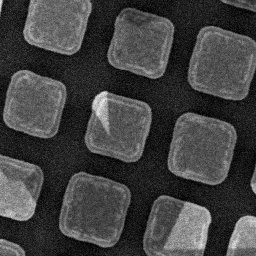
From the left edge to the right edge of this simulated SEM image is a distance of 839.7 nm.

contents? raised bodies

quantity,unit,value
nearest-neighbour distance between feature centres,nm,283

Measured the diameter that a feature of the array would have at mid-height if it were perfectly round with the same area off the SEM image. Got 66.5 px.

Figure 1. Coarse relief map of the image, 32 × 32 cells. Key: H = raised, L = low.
LLLLHHHHHHHLLLLLLLLLLLLLLLLLLHHH
LLLLHHHHHHHLLLLHHHLLLLLLLLLLLLLL
LLLHHHHHHHHLLLLHHHHHHLLLLLLLLLLL
LLLHHHHHHHHLLLHHHHHHHHLLLHHLLLLL
LLLHHHHHHHLLLLHHHHHHHHLLLHHHHHHL
LLLLHHHHHHLLLLHHHHHHHLLLHHHHHHHH
LLLLLLLHHLLLLLHHHHHHHLLLHHHHHHHH
LLLLLLLLLLLLLLHHHHHHHLLLHHHHHHHH
LLLLLLLLLLLLLLLHHHHHHLLLHHHHHHHH
LLHHHLLLLLLLLLLLLLHHLLLLHHHHHHHH
LHHHHHHHLLLLLLLLLLLLLLLLHHHHHHHL
LHHHHHHHLLLLLLLLLLLLLLLLLHHHHHHL
LHHHHHHHLLLLHHHHHLLLLLLLLLLLLLLL
LHHHHHHHLLLLHHHHHHHLLLLLLLLLLLLL
HHHHHHHHLLLHHHHHHHHLLLLHHHLLLLLL
LHHHHHHLLLLHHHHHHHHLLLHHHHHHHLLL
LLLHHHHLLLLHHHHHHHLLLLHHHHHHHLLL
LLLLLLLLLLLHHHHHHHLLLHHHHHHHHLLL
LLLLLLLLLLLHHHHHHHLLLHHHHHHHHLLL
LLLLLLLLLLLLLHHHHHLLLHHHHHHHHLLL
HHHHLLLLLLLLLLLLLLLLLHHHHHHHHLLL
HHHHHLLLLLLLLLLLLLLLLLHHHHHHLLLL
HHHHHLLLLHHHHHLLLLLLLLLLHHHHLLLH
HHHHHLLLHHHHHHHHLLLLLLLLLLLLLLLL
HHHHHLLLHHHHHHHHLLLLHLLLLLLLLLLL
HHHHHLLLHHHHHHHHLLLHHHHHLLLLLLLL
HHHHLLLLHHHHHHHHLLLHHHHHHHLLLLLL
LLHLLLLHHHHHHHHHLLLHHHHHHHLLLLHH
LLLLLLLLHHHHHHHLLLHHHHHHHHLLLHHH
LLLLLLLLHHHHHHHLLLHHHHHHHHLLLHHH
HHLLLLLLLLLLHHLLLLHHHHHHHHLLLHHH
HHHLLLLLLLLLLLLLLLHHHHHHHLLLLHHH